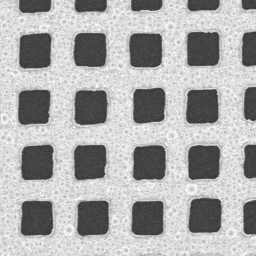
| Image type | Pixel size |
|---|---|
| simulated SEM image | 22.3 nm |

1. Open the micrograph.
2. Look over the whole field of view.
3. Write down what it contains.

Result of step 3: a regular array of holes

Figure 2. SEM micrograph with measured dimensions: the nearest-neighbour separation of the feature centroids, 1.22 um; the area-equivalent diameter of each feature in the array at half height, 818 nanometres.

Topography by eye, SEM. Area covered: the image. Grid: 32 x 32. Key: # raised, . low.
##....###....###....###....###..
###...####...###################
################################
################################
###...####...###....####...###..
##....###....###....###....###..
##....###....###....###.....##..
##....###....###....###....###..
###...##########################
################################
################################
###...####...####...####...####.
##....###....####....##....###..
##....###....####....##....###..
##....###....####....##....####.
###.######..############.#######
################################
################################
###....###...####...####...####.
###....##....####....##.....###.
###....##....####....##....####.
###....##....####....##....####.
###...##########################
################################
################################
###...####....###...####....###.
###....###....##....####....##..
###....###....##....####....##..
###....###....##....####...###..
###.############################
################################
################################